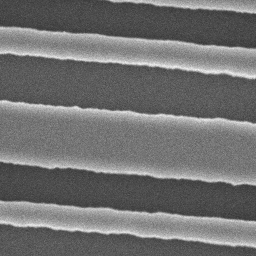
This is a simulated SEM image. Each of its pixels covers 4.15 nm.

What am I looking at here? lines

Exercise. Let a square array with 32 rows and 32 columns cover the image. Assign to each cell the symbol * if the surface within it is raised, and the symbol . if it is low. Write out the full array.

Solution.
...................*************
...............................*
................................
*...............................
*************...................
************************........
********************************
..........**********************
.......................*********
..............................**
................................
................................
................................
**********......................
**********************..........
********************************
********************************
********************************
********************************
********************************
..******************************
.............*******************
.........................*******
................................
................................
*****...........................
*****************...............
******************************..
......**************************
.................***************
............................****
................................